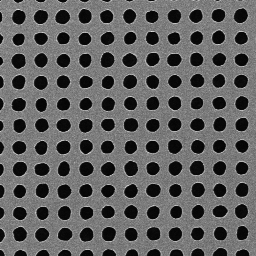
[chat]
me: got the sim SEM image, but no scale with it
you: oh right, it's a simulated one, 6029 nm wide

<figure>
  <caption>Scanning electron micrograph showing a regular array of holes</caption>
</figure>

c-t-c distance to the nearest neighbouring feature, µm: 0.506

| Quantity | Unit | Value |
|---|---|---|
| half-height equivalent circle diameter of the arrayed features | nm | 319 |